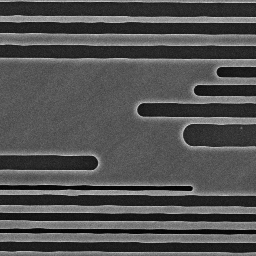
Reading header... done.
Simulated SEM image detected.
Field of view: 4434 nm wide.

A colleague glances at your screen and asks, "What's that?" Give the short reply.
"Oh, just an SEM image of groups of lines, slits or small figures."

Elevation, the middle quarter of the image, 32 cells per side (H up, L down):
HHHHHHHHHHHHHHHHHHHHHHHHHHHHHHHH
HHHHHHHHHHHHHHHHHHHHHHHHHHHHHHHH
HHHHHHHHHHHHHHHHHHHHHHHHHHHHHHHH
HHHHHHHHHHHHHHHHHHHHHHHHHHHHHHHH
HHHHHHHHHHHHHHHHHHHHHHHHHHHHHHHH
HHHHHHHHHHHHHHHHHHHHHHHHHHHHHHHH
HHHHHHHHHHHHHHHHHHHHHHHHHHHHHHHH
HHHHHHHHHHHHHHHHHHHHHHHHHHHHHHHH
HHHHHHHHHHHHHHHHHHHHHHHHHHHHHHHH
HHHHHHHHHHHHHHHHHHHHHHHHHHHHHHHH
HHHHHHHHHHHHHHHHHHHLLLLLLLLLLLLL
HHHHHHHHHHHHHHHHHHLLLLLLLLLLLLLL
HHHHHHHHHHHHHHHHHHHLLLLLLLLLLLLL
HHHHHHHHHHHHHHHHHHHHHHHHHHHHHHHH
HHHHHHHHHHHHHHHHHHHHHHHHHHHHHHHH
HHHHHHHHHHHHHHHHHHHHHHHHHHHHHHHL
HHHHHHHHHHHHHHHHHHHHHHHHHHHHHHLL
HHHHHHHHHHHHHHHHHHHHHHHHHHHHHHLL
HHHHHHHHHHHHHHHHHHHHHHHHHHHHHHLL
HHHHHHHHHHHHHHHHHHHHHHHHHHHHHHLL
HHHHHHHHHHHHHHHHHHHHHHHHHHHHHHHH
HHHHHHHHHHHHHHHHHHHHHHHHHHHHHHHH
HHHHHHHHHHHHHHHHHHHHHHHHHHHHHHHH
LLLLLLLLHHHHHHHHHHHHHHHHHHHHHHHH
LLLLLLLLLHHHHHHHHHHHHHHHHHHHHHHH
LLLLLLLLHHHHHHHHHHHHHHHHHHHHHHHH
LLLLLLLHHHHHHHHHHHHHHHHHHHHHHHHH
HHHHHHHHHHHHHHHHHHHHHHHHHHHHHHHH
HHHHHHHHHHHHHHHHHHHHHHHHHHHHHHHH
HHHHHHHHHHHHHHHHHHHHHHHHHHHHHHHH
LLLLLLLLLLLLLLLLLLLLLLHHHHLLLLLH
HHLLLLLLLLLLLLLLLLLLLLLLLLLLLLLL